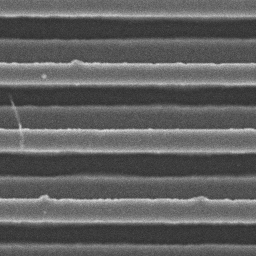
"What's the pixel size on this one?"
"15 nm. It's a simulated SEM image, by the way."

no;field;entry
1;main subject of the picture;lines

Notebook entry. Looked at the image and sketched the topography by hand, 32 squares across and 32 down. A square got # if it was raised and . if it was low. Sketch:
################################
################################
................................
................................
................................
################################
################################
################################
################################
################################
.###..############.######..#####
................................
................................
.#.#..##...#...#...#............
################################
################################
################################
################################
################################
................................
................................
................................
################################
################################
################################
################################
################################
################################
................................
................................
................................
################################